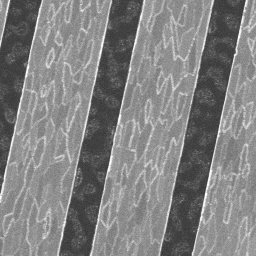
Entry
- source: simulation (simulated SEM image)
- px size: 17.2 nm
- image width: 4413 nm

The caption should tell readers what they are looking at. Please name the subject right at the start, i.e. one or a few lines or trenches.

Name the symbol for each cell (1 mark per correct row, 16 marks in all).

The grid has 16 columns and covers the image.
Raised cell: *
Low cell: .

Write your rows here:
...****..****..*
..*****..****..*
..****..*****..*
..****..*****..*
..****..****..**
.*****..****..**
.*****..****..**
.****..*****..**
.****..*****..**
.****..****..***
*****..****..***
*****..****..***
****..*****..***
****..****...***
****..****..****
****..****..****